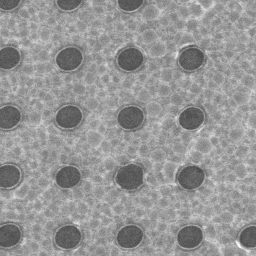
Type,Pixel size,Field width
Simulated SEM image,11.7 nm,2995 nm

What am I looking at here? a regular array of raised bodies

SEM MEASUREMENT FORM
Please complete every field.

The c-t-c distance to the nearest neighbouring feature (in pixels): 59.1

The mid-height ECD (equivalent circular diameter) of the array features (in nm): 304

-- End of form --